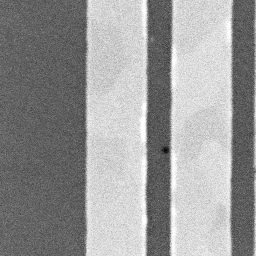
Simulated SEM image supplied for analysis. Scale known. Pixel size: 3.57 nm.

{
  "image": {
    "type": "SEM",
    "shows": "one or a few lines or trenches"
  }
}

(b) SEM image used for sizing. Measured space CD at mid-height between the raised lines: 0.0943 um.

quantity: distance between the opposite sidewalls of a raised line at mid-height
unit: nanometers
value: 208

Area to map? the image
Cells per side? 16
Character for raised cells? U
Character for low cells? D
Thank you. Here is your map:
DDDDDDUUUDDUUUDD
DDDDDDUUUDDUUUDD
DDDDDDUUUDDUUUDD
DDDDDUUUUDDUUUDD
DDDDDUUUUDDUUUDD
DDDDDUUUUDDUUUDD
DDDDDUUUUDDUUUDD
DDDDDUUUUDDUUUDD
DDDDDDUUUDDUUUDD
DDDDDDUUUDDUUUDD
DDDDDUUUUDDUUUDD
DDDDDUUUUDDUUUDD
DDDDDUUUUDDUUUDD
DDDDDUUUUDDUUUDD
DDDDDUUUUDDUUUDD
DDDDDUUUUDDUUUDD